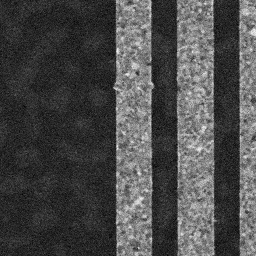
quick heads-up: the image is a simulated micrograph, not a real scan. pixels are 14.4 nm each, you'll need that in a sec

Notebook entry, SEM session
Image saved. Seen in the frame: one or a few lines or trenches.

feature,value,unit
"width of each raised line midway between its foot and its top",513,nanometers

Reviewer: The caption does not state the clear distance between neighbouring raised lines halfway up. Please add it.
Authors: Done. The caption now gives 383 nm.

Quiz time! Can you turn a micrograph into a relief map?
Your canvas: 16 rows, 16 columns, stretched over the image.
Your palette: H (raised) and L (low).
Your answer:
LLLLLLLHHLLHHLLH
LLLLLLLHHLLHHLLH
LLLLLLLHHLLHHLLH
LLLLLLLHHLLHHLLH
LLLLLLLHHLLHHLLH
LLLLLLLHHLLHHLLH
LLLLLLLHHLLHHLLH
LLLLLLLHHLLHHLLH
LLLLLLLHHLLHHLLH
LLLLLLLHHLLHHLLH
LLLLLLLHHLLHHLLH
LLLLLLLHHHLHHLLH
LLLLLLLHHLLHHLLH
LLLLLLLHHLLHHLLH
LLLLLLLHHLLHHLLH
LLLLLLLHHLLHHLLH